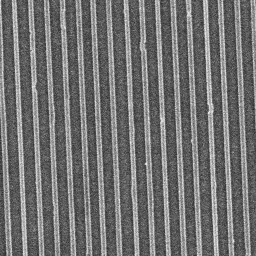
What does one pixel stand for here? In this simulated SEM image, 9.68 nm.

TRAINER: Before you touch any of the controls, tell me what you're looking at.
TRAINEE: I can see parallel lines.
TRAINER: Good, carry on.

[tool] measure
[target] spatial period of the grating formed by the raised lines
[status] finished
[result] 154 nm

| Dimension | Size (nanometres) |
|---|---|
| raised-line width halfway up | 37.5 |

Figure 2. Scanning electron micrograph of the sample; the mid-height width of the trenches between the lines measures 0.111 um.